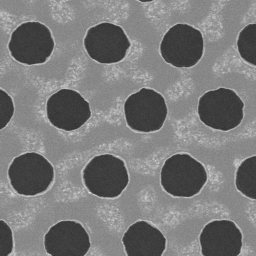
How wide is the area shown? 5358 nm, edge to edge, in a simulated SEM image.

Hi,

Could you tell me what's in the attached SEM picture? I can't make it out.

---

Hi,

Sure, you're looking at a regular array of holes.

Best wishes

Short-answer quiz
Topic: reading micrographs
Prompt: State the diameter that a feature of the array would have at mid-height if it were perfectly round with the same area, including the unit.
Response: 923 nm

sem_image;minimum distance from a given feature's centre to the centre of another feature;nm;1560